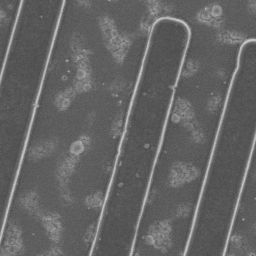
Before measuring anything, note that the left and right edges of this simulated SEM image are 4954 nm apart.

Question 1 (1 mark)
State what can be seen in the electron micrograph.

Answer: one or a few lines or trenches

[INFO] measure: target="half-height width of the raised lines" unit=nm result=733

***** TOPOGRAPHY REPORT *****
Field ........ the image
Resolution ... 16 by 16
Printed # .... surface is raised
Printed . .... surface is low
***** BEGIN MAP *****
.###............
.###......#.....
.##......###....
###......##....#
###......##....#
###.....###...##
##......###...##
##......##....##
##......##....##
#......###...###
#......###...##.
#......##....##.
#......##...###.
......###...###.
......###...##..
......##....##..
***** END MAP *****